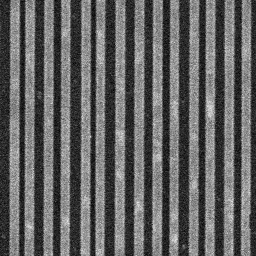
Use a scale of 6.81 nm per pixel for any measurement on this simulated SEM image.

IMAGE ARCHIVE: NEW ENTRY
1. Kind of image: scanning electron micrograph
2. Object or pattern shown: parallel lines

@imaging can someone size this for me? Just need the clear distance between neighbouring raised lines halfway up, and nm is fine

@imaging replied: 68.1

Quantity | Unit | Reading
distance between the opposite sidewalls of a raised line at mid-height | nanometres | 61.3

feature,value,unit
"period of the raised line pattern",0.121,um